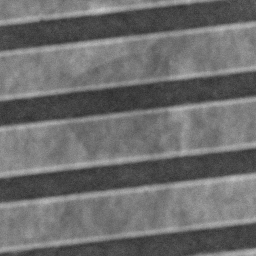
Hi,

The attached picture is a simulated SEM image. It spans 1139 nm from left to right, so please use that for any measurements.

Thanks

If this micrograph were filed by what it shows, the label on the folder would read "one or a few lines or trenches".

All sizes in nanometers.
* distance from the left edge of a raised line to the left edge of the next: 335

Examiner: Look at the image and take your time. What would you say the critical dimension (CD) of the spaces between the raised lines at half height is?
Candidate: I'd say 130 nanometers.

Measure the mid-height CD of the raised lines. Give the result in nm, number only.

206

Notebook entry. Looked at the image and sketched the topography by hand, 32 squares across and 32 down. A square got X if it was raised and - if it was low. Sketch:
XXXXXXXXXXXXXXXXXXXXX-----------
XXXXXXXXXXXX--------------------
XXXX----------------------------
---------------------------XXXXX
------------------XXXXXXXXXXXXXX
----------XXXXXXXXXXXXXXXXXXXXXX
-XXXXXXXXXXXXXXXXXXXXXXXXXXXXXXX
XXXXXXXXXXXXXXXXXXXXXXXXXXXXXXXX
XXXXXXXXXXXXXXXXXXXXXXXXXXXXXXXX
XXXXXXXXXXXXXXXXXXXXXXXX--------
XXXXXXXXXXXXXXXX----------------
XXXXXXXX------------------------
------------------------------XX
----------------------XXXXXXXXXX
-------------XXXXXXXXXXXXXXXXXXX
-----XXXXXXXXXXXXXXXXXXXXXXXXXXX
XXXXXXXXXXXXXXXXXXXXXXXXXXXXXXXX
XXXXXXXXXXXXXXXXXXXXXXXXXXXXXXXX
XXXXXXXXXXXXXXXXXXXXXXXXXXXXXX--
XXXXXXXXXXXXXXXXXXXXX-----------
XXXXXXXXXXXXX-------------------
XXXX----------------------------
---------------------------XXXXX
------------------XXXXXXXXXXXXXX
----------XXXXXXXXXXXXXXXXXXXXXX
--XXXXXXXXXXXXXXXXXXXXXXXXXXXXXX
XXXXXXXXXXXXXXXXXXXXXXXXXXXXXXXX
XXXXXXXXXXXXXXXXXXXXXXXXXXXXXXXX
XXXXXXXXXXXXXXXXXXXXXXXX--------
XXXXXXXXXXXXXXXX----------------
XXXXXXXX------------------------
------------------------------XX